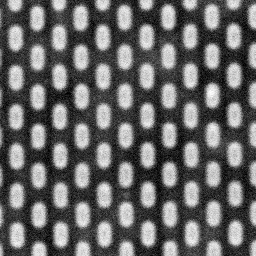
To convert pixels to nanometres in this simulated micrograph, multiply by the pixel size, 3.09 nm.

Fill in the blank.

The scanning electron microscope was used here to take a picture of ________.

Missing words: groups of lines, slits or small figures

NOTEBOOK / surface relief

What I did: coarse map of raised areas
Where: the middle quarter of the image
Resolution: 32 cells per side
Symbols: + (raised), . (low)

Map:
...+++...++...++....++...++....+
........+++........+++........++
........+++........+++........++
........+++........+++........++
........+++........+++........++
...++....++...++....++...++....+
...+++........+++........+++....
...+++........+++........+++....
...+++........+++........+++....
...+++........+++........+++....
...+++...++...++....++...++....+
.........++.........++........++
........+++.........++........++
........+++.........++........++
........+++.........++........++
....+....++...++....++...++....+
...+++........+++........+++....
...+++........+++........+++....
...+++........+++........+++....
...+++........+++........+++....
....++...++....+....++...++....+
+........++.........++........++
+........++.........++........++
+........++.........++........++
+........++.........++........++
....+....++...++....++...+++...+
...+++........+++........+++....
...+++........+++........+++....
...+++........+++........+++....
...+++........+++........+++....
....+....++....+....++....+....+
+........++.........++........++